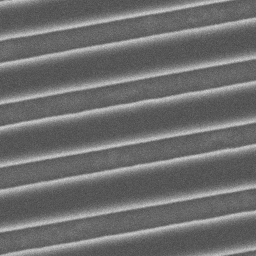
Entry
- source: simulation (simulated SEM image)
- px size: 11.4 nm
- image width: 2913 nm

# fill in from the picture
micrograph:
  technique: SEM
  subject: lines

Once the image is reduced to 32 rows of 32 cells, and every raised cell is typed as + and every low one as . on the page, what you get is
+++++++++++++++++++++++++.......
++++++++++++++++++++............
++++++++++++++.................+
+++++++++.................++++++
+++.................++++++++++++
..............++++++++++++++++++
........++++++++++++++++++++++++
...+++++++++++++++++++++++++++..
+++++++++++++++++++++++++.......
+++++++++++++++++++.............
+++++++++++++.................++
++++++++.................+++++++
+++................+++++++++++++
..............++++++++++++++++++
........++++++++++++++++++++++++
..++++++++++++++++++++++++++++..
++++++++++++++++++++++++........
+++++++++++++++++++.............
+++++++++++++.................++
+++++++.................++++++++
++.................+++++++++++++
.............+++++++++++++++++++
........++++++++++++++++++++++++
..+++++++++++++++++++++++++++++.
+++++++++++++++++++++++++.......
++++++++++++++++++++............
++++++++++++++..................
++++++++..................++++++
++..................++++++++++++
..............++++++++++++++++++
.........+++++++++++++++++++++++
...+++++++++++++++++++++++++++..